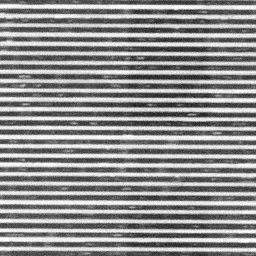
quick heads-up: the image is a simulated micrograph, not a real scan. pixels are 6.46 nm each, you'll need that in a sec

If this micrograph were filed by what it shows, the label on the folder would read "parallel lines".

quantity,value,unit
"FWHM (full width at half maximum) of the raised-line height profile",21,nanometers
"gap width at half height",41.2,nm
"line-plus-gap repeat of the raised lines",60.1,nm